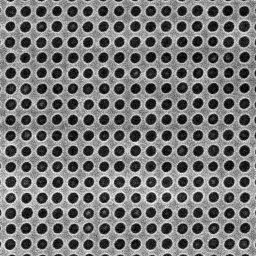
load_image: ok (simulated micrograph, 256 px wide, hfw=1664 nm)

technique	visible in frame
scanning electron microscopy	a regular array of holes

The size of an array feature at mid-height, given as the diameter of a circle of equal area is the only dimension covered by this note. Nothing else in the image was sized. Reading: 72.2 nanometres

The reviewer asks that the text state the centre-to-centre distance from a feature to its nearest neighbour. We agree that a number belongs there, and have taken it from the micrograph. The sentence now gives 0.0981 um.